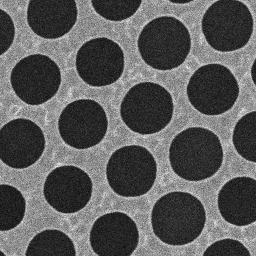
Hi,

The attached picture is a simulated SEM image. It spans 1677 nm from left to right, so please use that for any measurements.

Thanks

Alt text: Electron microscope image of a regular array of holes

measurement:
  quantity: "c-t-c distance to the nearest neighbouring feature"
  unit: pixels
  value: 65.5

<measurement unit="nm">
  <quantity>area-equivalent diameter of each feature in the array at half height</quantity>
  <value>338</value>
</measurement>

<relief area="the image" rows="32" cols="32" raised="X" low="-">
XXXX-----XXX------XXXXXXXXX---XX
-XX-------XX-----XXXXXXXXX-----X
-XX-------XXXX-XXXX---XXX-------
--XX-----XXXXXXXXX-----XX-------
--XXX---XXXXXXXXX-------XX-----X
-XXXXXXXXXX----XX-------XX-----X
-XXXXXXXXX-----XX-------XXXXXXXX
XXX---XXX------XXX-----XXXXXXXXX
XX-----XXX-----XXXX---XXX---XXX-
X-------XX-----XXXXXXXXX-----XX-
X-------XXX---XXX---XXXX------XX
XX-----XXXXXXXXX-----XX-------XX
XXX---XXXX-XXXX-------XX------XX
XXXXXXXX-----XX-------XX-----XXX
XXXXXXX------XX-------XXXXXXXX--
X---XXX------XXX-----XXXXXXXXX--
-----XX------XXXX---XXX----XX---
------XX-----XXXXXXXXX-----XX---
------XXX--XXXX---XXX-------X---
-----XXXXXXXXX-----XX-------XX--
X---XXXXXXXXX-------X-------XXXX
XXXXXX-----XX-------XX-----XXXXX
XXXXXX-----XX------XXXX--XXXX---
--XXX-------XX-----XXXXXXXXX----
---XXX-----XXXX--XXX----XXX-----
---XXX-----XXXXXXXX------XX-----
---XXXXX-XXXXX-XXXX-------X-----
---XXXXXXXXX-----XX-------XX----
--XXXXXXXXX------XX------XXXXXXX
XXXX----XXX------XXX-----XXXXXXX
XXXX-----XX------XXXX--XXXX---XX
XXX------XXX-----XXXXXXXXX-----X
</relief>